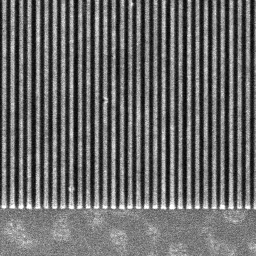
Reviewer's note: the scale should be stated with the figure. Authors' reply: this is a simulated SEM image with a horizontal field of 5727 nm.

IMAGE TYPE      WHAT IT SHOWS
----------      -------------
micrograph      parallel lines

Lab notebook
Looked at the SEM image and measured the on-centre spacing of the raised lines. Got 188 nanometers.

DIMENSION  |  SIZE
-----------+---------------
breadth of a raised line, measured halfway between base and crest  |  67.1 nm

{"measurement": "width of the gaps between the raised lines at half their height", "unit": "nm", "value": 109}